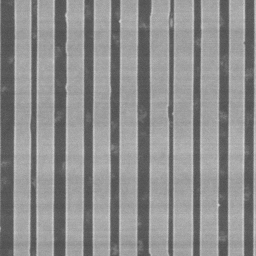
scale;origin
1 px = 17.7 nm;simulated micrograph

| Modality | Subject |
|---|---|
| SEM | parallel lines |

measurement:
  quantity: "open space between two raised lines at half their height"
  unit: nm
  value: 186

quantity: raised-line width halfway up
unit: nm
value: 293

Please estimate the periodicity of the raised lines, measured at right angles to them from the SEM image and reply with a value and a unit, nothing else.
0.474 microns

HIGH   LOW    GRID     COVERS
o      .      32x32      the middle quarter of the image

.oooo...ooo...oooo....oooo..oooo
.oooo...ooo...oooo....oooo..oooo
.oooo...ooo...oooo....oooo..oooo
.oooo...ooo...oooo....oooo..oooo
.oooo...ooo...oooo....oooo..oooo
.oooo...ooo...oooo....oooo..oooo
.oooo...ooo...oooo....oooo..oooo
.oooo...ooo...oooo....oooo..oooo
.oooo...ooo...oooo....oooo..oooo
.oooo...ooo...oooo....oooo..oooo
.oooo...ooo...oooo....oooo..oooo
.oooo...ooo...oooo....oooo..oooo
.oooo...ooo...oooo....oooo.ooooo
.oooo...ooo...oooo....oooo..oooo
.oooo...ooo...oooo....oooo..oooo
.oooo...ooo...oooo....oooo..oooo
.oooo...ooo...oooo....oooo..oooo
.oooo...ooo...oooo....oooo..oooo
.oooo...ooo...oooo....oooo..oooo
.oooo...ooo...oooo....oooo..oooo
.oooo...ooo...oooo....oooo..oooo
.oooo...ooo...oooo....oooo..oooo
.oooo...ooo...oooo....oooo..oooo
.oooo...ooo...oooo....oooo..oooo
.oooo..oooo...oooo....oooo..oooo
.oooo..oooo...oooo....oooo..oooo
.oooo..oooo...oooo....oooo..oooo
.oooo..oooo...oooo....oooo..oooo
.oooo..oooo...oooo....oooo..oooo
.oooo..oooo...oooo....oooo..oooo
.oooo..oooo...oooo....oooo.ooooo
.oooo..oooo...oooo....oooo.ooooo